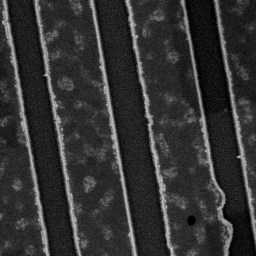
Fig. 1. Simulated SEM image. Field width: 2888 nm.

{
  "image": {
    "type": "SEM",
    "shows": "one or a few lines or trenches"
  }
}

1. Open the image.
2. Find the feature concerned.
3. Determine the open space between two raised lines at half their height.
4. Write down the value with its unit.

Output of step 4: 0.357 um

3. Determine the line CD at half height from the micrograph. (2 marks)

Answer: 618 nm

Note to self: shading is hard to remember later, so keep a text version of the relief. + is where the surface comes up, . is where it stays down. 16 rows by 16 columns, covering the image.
..++++..++++..++
..++++..++++..++
+..+++..++++..++
+..+++...+++..++
+..+++...+++..++
+..++++..+++..++
+..++++..++++..+
++..+++..++++..+
++..+++..++++..+
++..+++...+++..+
++..++++..+++..+
++..++++..++++.+
++..++++..++++..
+++..+++..++++..
+++..+++..++++..
+++..+++...+++..